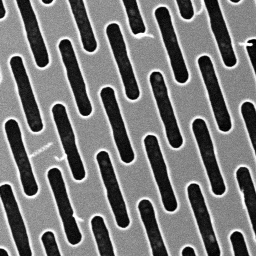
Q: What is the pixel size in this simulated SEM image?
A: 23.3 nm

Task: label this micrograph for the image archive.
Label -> a regular array of holes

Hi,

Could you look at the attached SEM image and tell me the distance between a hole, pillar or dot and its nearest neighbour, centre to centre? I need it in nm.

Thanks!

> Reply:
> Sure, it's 1190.